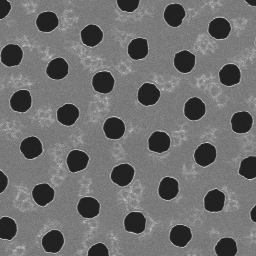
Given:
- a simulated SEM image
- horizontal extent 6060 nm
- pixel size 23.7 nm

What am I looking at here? a regular array of holes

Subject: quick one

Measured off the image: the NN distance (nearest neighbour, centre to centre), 1120 nm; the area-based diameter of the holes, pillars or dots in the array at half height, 0.521 µm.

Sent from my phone